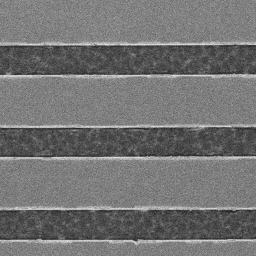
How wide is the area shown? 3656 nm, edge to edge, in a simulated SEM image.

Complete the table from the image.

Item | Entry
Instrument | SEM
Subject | one or a few lines or trenches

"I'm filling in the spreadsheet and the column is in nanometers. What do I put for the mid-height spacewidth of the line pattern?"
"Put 434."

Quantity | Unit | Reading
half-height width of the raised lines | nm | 739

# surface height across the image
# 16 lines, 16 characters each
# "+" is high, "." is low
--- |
++++++++++++++++
++++++++++++++++
++++++++++++++++
................
..........+.....
++++++++++++++++
++++++++++++++++
++++++++++++++++
................
................
++++++++++++++++
++++++++++++++++
++++++++++++++++
................
................
++++++++++++++++